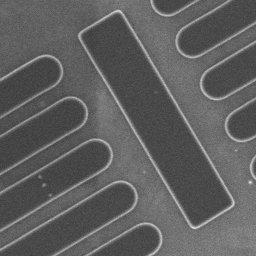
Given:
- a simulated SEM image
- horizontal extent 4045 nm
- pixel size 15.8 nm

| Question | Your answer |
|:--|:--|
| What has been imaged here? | groups of lines, slits or small figures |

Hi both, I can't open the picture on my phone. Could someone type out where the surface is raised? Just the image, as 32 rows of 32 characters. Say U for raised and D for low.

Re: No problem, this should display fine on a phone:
DDDDDDDDDDDDDDDDDDDUUUUUDDDDUUUU
DDDDDDDDDDDDDDUDDDDDUUDDDDUUUUUU
DDDDDDDDDDDDUUUUDDDDDDDDUUUUUUUU
DDDDDDDDDDDUUUUUDDDDDDDUUUUUUUUD
DDDDDDDDDDUUUUUUUDDDDDUUUUUUUDDD
DDDDDDDDDDUUUUUUUUDDDDUUUUUUDDDU
DDDDDDDDDDDUUUUUUUDDDDUUUUDDDDUU
DDDDUUUDDDDUUUUUUUUDDDDDDDDDUUUU
DDUUUUUUDDDDUUUUUUUDDDDDDDUUUUUU
DUUUUUUUDDDDDUUUUUUUDDDDDUUUUUUU
UUUUUUUDDDDDDUUUUUUUUDDDDUUUUUUD
UUUUUUDDDDDDDDUUUUUUUDDDDUUUUDDD
UUUUDDDDUUDDDDDUUUUUUUDDDDDDDDDU
UUDDDDUUUUUDDDDUUUUUUUDDDDDDDDUU
DDDDUUUUUUUDDDDDUUUUUUUDDDDDDUUU
DDUUUUUUUUDDDDDDUUUUUUUUDDDDUUUU
DUUUUUUUUDDDDDDDDUUUUUUUDDDDUUUU
UUUUUUUDDDDUDDDDDUUUUUUUUDDDDUUD
UUUUUUDDDUUUUUDDDDUUUUUUUDDDDDDD
UUUUDDDDUUUUUUDDDDDUUUUUUUDDDDDD
UUDDDDUUUUUUUUDDDDDUUUUUUUUDDDDU
UDDDUUUUUUUUUDDDDDDDUUUUUUUDDDDU
DDDUUUUUUUUDDDDDDDDDUUUUUUUUDDDD
DUUUUUUUUDDDDUUUUDDDDUUUUUUUDDDD
UUUUUUUDDDDUUUUUUDDDDDUUUUUUUDDD
UUUUUUDDDDUUUUUUUDDDDDUUUUUUUDDD
UUUUDDDDUUUUUUUUDDDDDDDUUUUUDDDD
UUUDDDUUUUUUUUDDDDDDDDDUUUDDDDDD
UDDDUUUUUUUUUDDDUUUUDDDDDDDDDDDD
DDDUUUUUUUUDDDDUUUUUDDDDDDDDDDDD
DUUUUUUUUDDDDUUUUUUUDDDDDDDDDDDD
UUUUUUUUDDDUUUUUUUUDDDDDDDDDDDDD